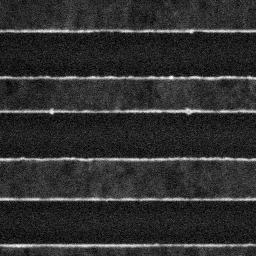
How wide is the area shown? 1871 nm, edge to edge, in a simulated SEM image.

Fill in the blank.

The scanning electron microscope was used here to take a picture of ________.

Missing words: lines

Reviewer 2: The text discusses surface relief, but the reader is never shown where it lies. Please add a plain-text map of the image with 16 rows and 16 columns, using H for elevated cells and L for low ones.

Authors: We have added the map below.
HHHHHHHHHHHHHHHH
HHHHHHHHHHHHHHHH
LLLLLLLLLLLLLLLL
LLLLLLLLLLLLLLLL
LLLLLLLLLLLLLLLL
HHHHHHHHHHHHHHHH
HHHHHHHHHHHHHHHH
LLLLLLLLLLLLLLLL
LLLLLLLLLLLLLLLL
LLLLLLLLLLLLLLLL
HHHHHHHHHHHHHHHH
HHHHHHHHHHHHHHHH
LLLLLLLLLLLLLLLL
LLLLLLLLLLLLLLLL
LLLLLLLLLLLLLLLL
HHHHHHHHHHHHHHHH